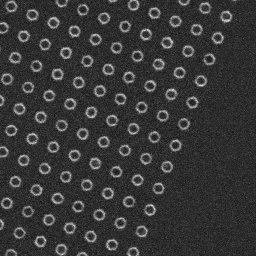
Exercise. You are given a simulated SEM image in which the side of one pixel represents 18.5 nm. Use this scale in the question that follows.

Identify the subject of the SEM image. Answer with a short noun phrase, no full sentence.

a regular array of raised bodies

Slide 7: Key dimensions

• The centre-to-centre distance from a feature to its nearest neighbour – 0.415 um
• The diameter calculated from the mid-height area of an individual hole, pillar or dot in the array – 184 nm